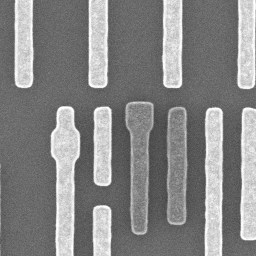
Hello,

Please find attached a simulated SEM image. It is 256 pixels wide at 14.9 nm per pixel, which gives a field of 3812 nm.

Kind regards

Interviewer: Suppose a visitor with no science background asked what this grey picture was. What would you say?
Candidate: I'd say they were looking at wiring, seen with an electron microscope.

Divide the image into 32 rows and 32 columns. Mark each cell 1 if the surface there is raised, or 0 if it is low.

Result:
00110000000110000000111000000011
00110000000110000000111000000011
00110000000110000000111000000011
00110000000110000000111000000011
00110000000110000000111000000011
00110000000110000000111000000011
00110000000110000000111000000011
00110000000110000000111000000011
00110000000110000000111000000011
00110000000110000000111000000011
00110000000110000000011000000011
00000000000000000000000000000000
00000000000000000000000000000000
00000000100010001110001000000000
00000001100011001110011000110011
00000001100011001110011000110011
00000001110011001110011000110011
00000011110011001110011000110011
00000011110011001100011000110011
00000001110011001100011000110011
00000001100011001100011000110011
00000001100011001100011000110011
00000001100011001100011000110011
00000001100000001100011000110011
00000001100000001100011000110011
00000001100000001100011000110011
00000001100011001100011000110011
00000001100011001100011000110011
00000001100011001100000000110011
00000001100011000000000000110011
00000001100011000000000000110000
00000001100011000000000000110000